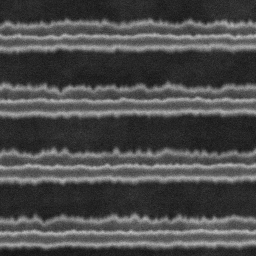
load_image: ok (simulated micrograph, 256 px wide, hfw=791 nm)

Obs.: lines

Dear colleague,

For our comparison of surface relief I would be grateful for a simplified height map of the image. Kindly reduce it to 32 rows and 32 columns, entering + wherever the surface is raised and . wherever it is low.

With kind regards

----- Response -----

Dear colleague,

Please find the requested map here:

................................
................................
................................
++++++++++++++++++++++++++++++++
++++++++++++++++++++++++++++++++
++++++++++++++++++++++++++++++++
................................
................................
................................
................................
................................
+++++++.++++++++++++++++++++++++
++++++++++++++++++++++++++++++++
++++++++++++++++++++++++++++++++
................................
................................
................................
................................
................................
++++.+++++++++++++++++++++++++++
++++++++++++++++++++++++++++++++
++++++++++++++++++++++++++++++++
+++++.++++++..+++...........+...
................................
................................
................................
................................
....+..+++...++++++...+.....++++
++++++++++++++++++++++++++++++++
++++++++++++++++++++++++++++++++
+++++++++++++++++++++++++++++++.
................................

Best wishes